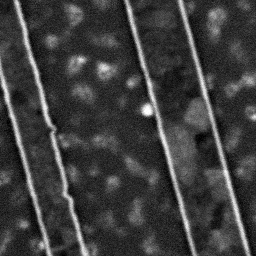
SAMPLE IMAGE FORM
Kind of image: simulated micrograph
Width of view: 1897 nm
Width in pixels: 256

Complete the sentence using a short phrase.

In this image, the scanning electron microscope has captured one or a few lines or trenches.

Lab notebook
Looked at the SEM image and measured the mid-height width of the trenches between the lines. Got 785 nm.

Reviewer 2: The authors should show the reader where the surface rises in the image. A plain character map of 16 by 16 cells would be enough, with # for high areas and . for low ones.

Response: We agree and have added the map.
#.......###.....
#.......####....
##.......###....
##.......###....
##.......###....
###......####...
.##.......###...
.##.......###...
.##.......####..
.###......####..
..##.......###..
..##.......###..
..##.......####.
..###......####.
...##.......###.
...##.......###.